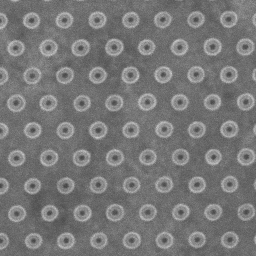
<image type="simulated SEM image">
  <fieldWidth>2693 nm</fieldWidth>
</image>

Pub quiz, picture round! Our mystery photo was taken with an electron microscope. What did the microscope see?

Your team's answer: a regular array of ring-shaped raised bodies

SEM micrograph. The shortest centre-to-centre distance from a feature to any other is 334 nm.